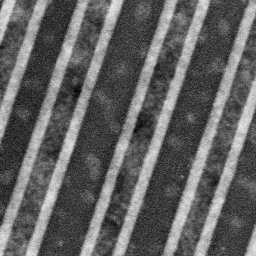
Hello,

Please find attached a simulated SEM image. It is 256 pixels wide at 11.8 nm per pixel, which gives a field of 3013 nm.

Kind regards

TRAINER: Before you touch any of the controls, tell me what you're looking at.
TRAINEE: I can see one or a few lines or trenches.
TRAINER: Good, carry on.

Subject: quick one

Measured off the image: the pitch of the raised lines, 947 nm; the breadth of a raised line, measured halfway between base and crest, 347 nm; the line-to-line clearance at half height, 49.5 px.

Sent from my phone